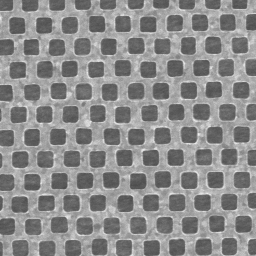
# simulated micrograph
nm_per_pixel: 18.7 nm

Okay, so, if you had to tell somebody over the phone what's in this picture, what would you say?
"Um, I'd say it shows a regular array of holes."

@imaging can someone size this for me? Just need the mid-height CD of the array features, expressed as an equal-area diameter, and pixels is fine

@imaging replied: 18.2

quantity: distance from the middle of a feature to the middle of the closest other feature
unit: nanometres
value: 468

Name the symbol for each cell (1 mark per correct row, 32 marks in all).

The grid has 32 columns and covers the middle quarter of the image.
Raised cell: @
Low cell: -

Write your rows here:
----@@----@@-----@@----@@@----@@
----@@----@@@----@@----@@@----@@
---@@@----@@@----@@----@@@----@@
@@@@@@@--@@@@@@@@@@@--@@@@@@@@@@
@@@@@@@@@@@@@@@@@@@@@@@@@@@@@@@@
-@@----@@@---@@@----@@----@@@---
-@@----@@----@@@----@@----@@@---
-@@----@@-----@@----@@----@@@---
-@@----@@@---@@@----@@@---@@@@--
@@@@@@@@@@@@@@@@@@@@@@@@@@@@@@@@
@--@@@@---@@@@--@@@@---@@@----@@
----@@-----@@----@@-----@@----@@
----@@----@@@----@@-----@@----@@
----@@----@@@----@@-----@@----@@
---@@@@@-@@@@---@@@@@--@@@@@@@@@
@@@@@@@@@@@@@@@@@@@@@@@@@@@@@@@@
@@@----@@@----@@----@@@---@@@---
-@@----@@@----@@----@@-----@@---
-@@----@@@----@@----@@-----@@---
@@@----@@@----@@----@@@----@@@--
@@@@@@@@@@@@@@@@@@@@@@@@@@@@@@@@
@@-@@@@@@@@@@@--@@@@@@-@@@----@@
----@@----@@@----@@-----@@----@@
----@@@---@@@----@@-----@@----@@
----@@@---@@@----@@@----@@----@@
----@@@---@@@----@@@@@@@@@@--@@@
@@@@@@@@@@@@@@@@@@@@@@@@@@@@@@@@
-@@----@@@----@@@---@@@----@@---
-@@----@@@----@@@---@@@----@@---
-@@----@@@----@@-----@@----@@---
-@@----@@@----@@-----@@----@@---
@@@@@@@@@@@@@@@@@---@@@@@@@@@@@@